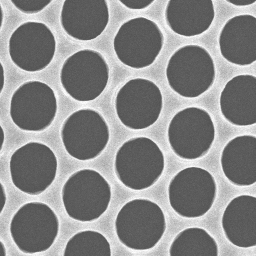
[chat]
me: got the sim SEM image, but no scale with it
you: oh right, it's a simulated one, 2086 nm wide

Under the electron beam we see a regular array of holes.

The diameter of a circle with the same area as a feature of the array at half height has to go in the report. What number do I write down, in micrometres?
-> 0.4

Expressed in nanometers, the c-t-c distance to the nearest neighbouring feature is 485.